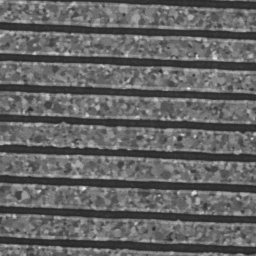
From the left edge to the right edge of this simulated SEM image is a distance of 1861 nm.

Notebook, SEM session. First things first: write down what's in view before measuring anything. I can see parallel lines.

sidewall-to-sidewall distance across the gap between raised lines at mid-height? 76.2 nm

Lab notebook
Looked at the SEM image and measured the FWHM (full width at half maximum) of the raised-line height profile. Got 147 nanometres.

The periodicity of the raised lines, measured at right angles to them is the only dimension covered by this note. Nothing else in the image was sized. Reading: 222 nanometres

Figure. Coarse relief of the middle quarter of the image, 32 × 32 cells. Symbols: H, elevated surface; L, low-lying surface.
HHHHHHHHHLLLLLLLLLLLLLLLLLLLLLLL
HHHHHHHHHHHHHHHHHHHHHHHHHHHHHLLL
HHHHHHHHHHHHHHHHHHHHHHHHHHHHHHHH
HHHHHHHHHHHHHHHHHHHHHHHHHHHHHHHH
HHHHHHHHHHHHHHHHHHHHHHHHHHHHHHHH
LLLLLLLLLLLLLHHHHHHHHHHHHHHHHHHH
LLLLLLLLLLLLLLLLLLLLLLLLLLLLLLLL
LLLLLLLLLLLLLLLLLLLLLLLLLLLLLLLL
HHHHHHHHHHHHHLLLLLLLLLLLLLLLLLLL
HHHHHHHHHHHHHHHHHHHHHHHHHHHHHHHH
HHHHHHHHHHHHHHHHHHHHHHHHHHHHHHHH
HHHHHHHHHHHHHHHHHHHHHHHHHHHHHHHH
HHHHHHHHHHHHHHHHHHHHHHHHHHHHHHHH
LLLLLLLLLLLLLLLLLLLLLLHHHHHHHHHH
LLLLLLLLLLLLLLLLLLLLLLLLLLLLLLLL
HLLLLLLLLLLLLLLLLLLLLLLLLLLLLLLL
HHHHHHHHHHHHHHHHHHHHHHHHLLLLLLLL
HHHHHHHHHHHHHHHHHHHHHHHHHHHHHHHH
HHHHHHHHHHHHHHHHHHHHHHHHHHHHHHHH
HHHHHHHHHHHHHHHHHHHHHHHHHHHHHHHH
LLLHHHLLHHHHHHHHHHHHHHHHHHHHHHHH
LLLLLLLLLLLLLLLLLLLLLLLLLLLLLLLH
LLLLLLLLLLLLLLLLLLLLLLLLLLLLLLLL
HHHHHHHHHHHHLLLLLLLLLLLLLLLLLLLL
HHHHHHHHHHHHHHHHHHHHHHHHHHHHHHHL
HHHHHHHHHHHHHHHHHHHHHHHHHHHHHHHH
HHHHHHHHHHHHHHHHHHHHHHHHHHHHHHHH
HHHHHHHHHHHHHHHHHHHHHHHHHHHHHHHH
LLLLLLLLLLLLLLHHHHHHHHHHHHHHHHHH
LLLLLLLLLLLLLLLLLLLLLLLLLLLLLLLL
LLLLLLLLLLLLLLLLLLLLLLLLLLLLLLLL
HHHHHHHHHHHHHHLLLLLLLLLLLLLLLLLL